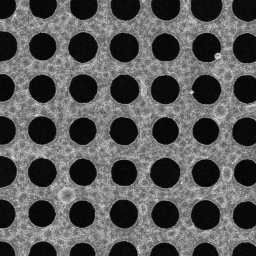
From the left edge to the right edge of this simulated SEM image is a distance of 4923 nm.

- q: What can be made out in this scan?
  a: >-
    a regular array of holes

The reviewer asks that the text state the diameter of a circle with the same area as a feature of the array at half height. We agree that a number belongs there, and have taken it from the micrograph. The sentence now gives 546 nm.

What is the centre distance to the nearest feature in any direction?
40.6 px